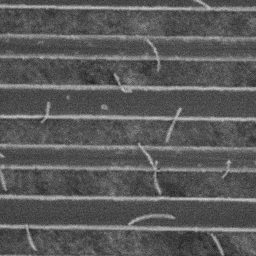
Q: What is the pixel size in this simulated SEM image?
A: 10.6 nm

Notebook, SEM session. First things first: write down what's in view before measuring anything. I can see lines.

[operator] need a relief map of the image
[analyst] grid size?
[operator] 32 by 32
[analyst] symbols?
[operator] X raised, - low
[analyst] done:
XXXXXXXXXXXXXXXXXXXXXXXXXXXXXXXX
--------------------------------
--------------------------------
--------------------------------
--------------------------------
XXXXXXXXXXXXXXXXXXXXXXXXXXXXXXXX
XXXXXXXXXXXXXXXXXXXXXXXXXXXXXXXX
--------------------------------
--------------------------------
--------------------------------
--------------------------------
XXXXXXXXXXXXXXXXXXXXXXXXXXXXXXXX
XXXXXXXXXXXXXXXXXXXXXXXXXXXXXXXX
XXXXXXXXXXXXXXXXXXXXXXXXXXXXXXXX
XXXXXXXXXXXXXXXXXXXXXXXXXXXXXXXX
--------------------------------
--------------------------------
--------------------------------
XXXXXXXXXXXXX-X--X--------------
XXXXXXXXXXXXXXXXXXXXXXXXXXXXXXXX
XXXXXXXXXXXXXXXXXXXXXXXXXXXXXXXX
--------------------------------
--------------------------------
--------------------------------
--------------------------------
XXXXXXXXXXXXXXXXXXXXXXXXXXXXXXXX
XXXXXXXXXXXXXXXXXXXXXXXXXXXXXXXX
XXXXXXXXXXXXXXXXXXXXXXXXXXXXXXXX
--------------------XXXXXXXXXXXX
--------------------------------
--------------------------------
--------------------------------